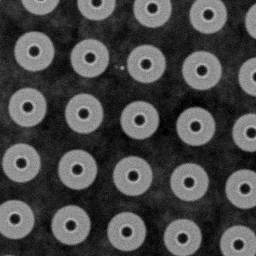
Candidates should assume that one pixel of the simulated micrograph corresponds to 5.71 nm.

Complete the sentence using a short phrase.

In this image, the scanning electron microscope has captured an array of small figures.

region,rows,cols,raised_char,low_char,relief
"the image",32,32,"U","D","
DDDUUUUDDDUUUUDDDUUUUDDDUUUUDDDD
DDDDUUDDDDUUUUDDDUUUUDDDUUUUDDDU
DDDDDDDDDDDDUDDDDUUUUDDDUUUUDDDU
DDDDDDDDDDDDDDDDDDDDDDDDUUUUDDDU
DDDUUUDDDDDDDDDDDDDDDDDDDDDDDDDU
DDUUUUUDDDUUUDDDDDDDDDDDDDDDDDDD
DDUUUUUDDUUUUDDDUUUUDDDDDUDDDDDD
DDUUUUUDDUUUUUDDUUUUUDDUUUUDDDDU
DDDUUUDDDUUUUDDDUUUUUDDUUUUUDDUU
DDDDDDDDDDUUDDDDUUUUDDDUUUUUDDUU
DDDDDDDDDDDDDDDDDDDDDDDDUUUDDDUU
DDUUUDDDDDDDDDDDDDDDDDDDDDDDDDDU
DUUUUUDDDUUUDDDDDDDDDDDDDDDDDDDD
DUUUUUDDUUUUUDDDUUUDDDDDUDDDDDDD
DUUUUUDDUUUUUDDUUUUUDDUUUUDDDDUU
DDUUUDDDUUUUDDDUUUUUDDUUUUUDDUUU
DDDDDDDDDDUDDDDDUUUDDDUUUUUDDUUU
DDDDDDDDDDDDDDDDDDDDDDDUUUDDDUUU
DUUUDDDDDDDDDDDDDDDDDDDDDDDDDDUU
UUUUUDDDUUUDDDDDDDDDDDDDDDDDDDDD
UUUUUDDUUUUUDDDUUUUDDDDUDDDDDDDD
DUUUUDDUUUUUDDUUUUUDDDUUUUDDDUUU
DDUUDDDDUUUUDDUUUUUDDUUUUUDDUUUU
DDDDDDDDDUUDDDDUUUUDDUUUUUDDUUUU
DDDDDDDDDDDDDDDDDDDDDDUUUDDDUUUU
UUUDDDDDDDDDDDDDDDDDDDDDDDDDDUUU
UUUUDDDUUUUDDDDDDDDDDDDDDDDDDDDD
UUUUDDDUUUUDDDUUUUDDDDUUDDDDDDDD
UUUUDDUUUUUDDUUUUUDDDUUUUDDDDUUD
DUUDDDDUUUUDDDUUUUDDDUUUUDDDUUUU
DDDDDDDDUUDDDDUUUUDDDUUUUDDDUUUU
DDDDDDDDDDDDDDDDDDDDDUUUDDDDUUUU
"